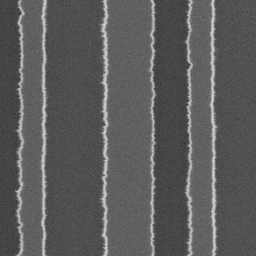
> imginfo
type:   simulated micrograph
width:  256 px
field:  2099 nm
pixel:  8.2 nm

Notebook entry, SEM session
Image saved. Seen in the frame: lines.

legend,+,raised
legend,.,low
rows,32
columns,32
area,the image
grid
..++++.......++++++.....+++.....
...++........++++++.....+++.....
..+++........++++++.....+++.....
...++........++++++.....+++.....
...++........++++++.....++......
...++........++++++....+++......
...++........++++++.....+++.....
...+++.......++++++.....+++.....
...++........++++++.....+++.....
...++........++++++.....+++.....
...++........++++++.....+++.....
..+++........++++++.....+++.....
...++........++++++.....+++.....
...++........++++++.....++......
...++........++++++.....+++.....
...++........++++++.....+++.....
..+++........++++++.....+++.....
...++........++++++.....+++.....
...++........++++++.....+++.....
...++........++++++.....+++.....
..+++........++++++.....+++.....
...++........++++++.....+++.....
...++........++++++.....+++.....
...++........++++++....++++.....
..+++........++++++.....+++.....
..+++........++++++.....+++.....
..+++........++++++.....+++.....
..+++........++++++.....+++.....
...++........++++++.....+++.....
...++........++++++.....+++.....
...++........++++++.....+++.....
...++........++++++.....+++.....